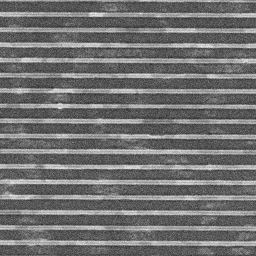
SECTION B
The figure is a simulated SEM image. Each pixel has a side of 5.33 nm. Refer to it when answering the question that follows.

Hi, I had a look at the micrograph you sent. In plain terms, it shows parallel lines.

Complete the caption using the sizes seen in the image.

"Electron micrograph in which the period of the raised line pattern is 0.0811 micrometres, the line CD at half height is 19.3 nm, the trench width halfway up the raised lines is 63.9 nm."